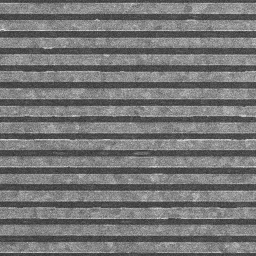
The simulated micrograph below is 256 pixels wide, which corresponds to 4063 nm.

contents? parallel lines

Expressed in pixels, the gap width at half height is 7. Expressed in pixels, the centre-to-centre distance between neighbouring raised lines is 17.1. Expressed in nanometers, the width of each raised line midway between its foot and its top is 165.